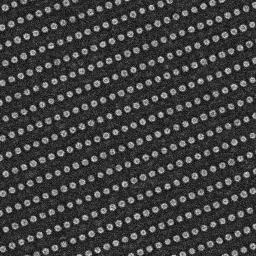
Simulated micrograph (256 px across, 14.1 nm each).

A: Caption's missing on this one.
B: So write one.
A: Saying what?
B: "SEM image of a regular array of raised bodies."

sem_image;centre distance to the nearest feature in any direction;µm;0.137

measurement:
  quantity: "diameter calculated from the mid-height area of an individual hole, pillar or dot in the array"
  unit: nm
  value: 82.8